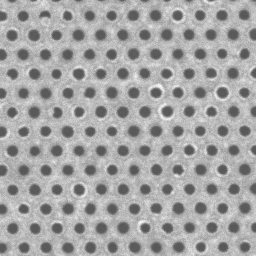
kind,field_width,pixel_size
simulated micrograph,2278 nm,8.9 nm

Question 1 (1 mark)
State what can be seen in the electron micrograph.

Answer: a regular array of holes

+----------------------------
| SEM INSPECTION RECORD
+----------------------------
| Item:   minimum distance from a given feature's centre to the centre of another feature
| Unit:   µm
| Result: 0.195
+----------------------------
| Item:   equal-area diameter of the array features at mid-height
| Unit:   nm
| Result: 101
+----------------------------